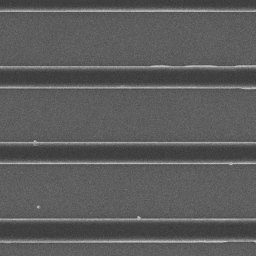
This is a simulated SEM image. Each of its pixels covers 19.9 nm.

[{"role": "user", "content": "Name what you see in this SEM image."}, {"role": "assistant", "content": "lines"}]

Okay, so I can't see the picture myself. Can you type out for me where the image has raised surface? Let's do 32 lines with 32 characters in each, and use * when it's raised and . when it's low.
********************************
................................
................................
................................
................................
................................
................................
................................
********************************
********************************
********************************
................................
................................
................................
................................
................................
................................
................................
********************************
********************************
............................*...
................................
................................
................................
................................
................................
................................
********************************
********************************
********************************
................................
................................